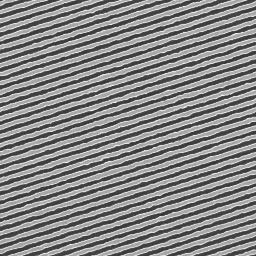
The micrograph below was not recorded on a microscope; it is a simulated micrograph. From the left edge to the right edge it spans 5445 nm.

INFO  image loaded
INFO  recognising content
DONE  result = parallel lines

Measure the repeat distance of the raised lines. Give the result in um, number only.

0.18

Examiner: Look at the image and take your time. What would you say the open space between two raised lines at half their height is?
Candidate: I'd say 76.2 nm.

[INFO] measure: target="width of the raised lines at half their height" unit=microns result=0.0939